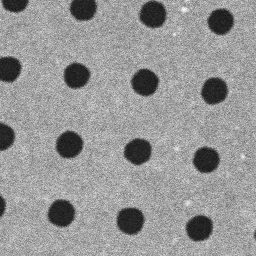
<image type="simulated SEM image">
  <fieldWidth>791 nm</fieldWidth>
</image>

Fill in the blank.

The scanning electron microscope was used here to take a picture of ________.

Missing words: a regular array of holes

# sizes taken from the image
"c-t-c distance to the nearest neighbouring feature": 212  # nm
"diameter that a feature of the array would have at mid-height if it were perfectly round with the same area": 85.1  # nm